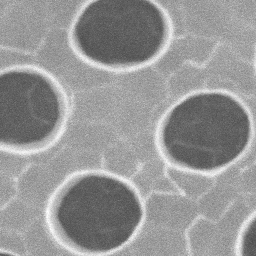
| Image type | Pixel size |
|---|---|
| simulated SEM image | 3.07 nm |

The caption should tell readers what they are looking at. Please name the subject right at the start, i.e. holes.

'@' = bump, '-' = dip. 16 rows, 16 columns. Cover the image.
@@@@@-----@@@@@@
@@@@@-----@@@@@@
@@@@@-----@@@@@@
@@@@@-----@@@@@@
--@@@@@@@@@@@@@@
----@@@@@@@@@@@@
----@@@@@@@----@
----@@@@@@------
---@@@@@@@------
@@@@@@@@@@-----@
@@@@@@@@@@@@--@@
@@@@----@@@@@@@@
@@@------@@@@@@@
@@@------@@@@@@@
@@@@----@@@@@@@-
@@@@@--@@@@@@@@-